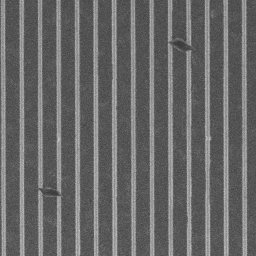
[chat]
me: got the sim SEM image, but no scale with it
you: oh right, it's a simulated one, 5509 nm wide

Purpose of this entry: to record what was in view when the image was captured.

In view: parallel lines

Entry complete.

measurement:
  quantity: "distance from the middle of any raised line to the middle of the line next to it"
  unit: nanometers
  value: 399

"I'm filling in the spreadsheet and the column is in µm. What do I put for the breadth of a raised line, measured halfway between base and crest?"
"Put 0.078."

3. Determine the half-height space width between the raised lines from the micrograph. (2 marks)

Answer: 0.317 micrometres